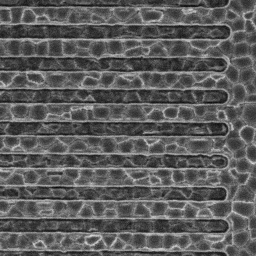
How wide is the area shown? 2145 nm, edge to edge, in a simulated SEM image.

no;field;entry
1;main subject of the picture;parallel lines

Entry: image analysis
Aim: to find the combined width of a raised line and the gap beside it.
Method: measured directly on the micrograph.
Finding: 270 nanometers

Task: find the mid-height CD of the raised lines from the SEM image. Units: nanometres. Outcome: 148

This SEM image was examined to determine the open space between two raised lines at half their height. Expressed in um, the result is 0.124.